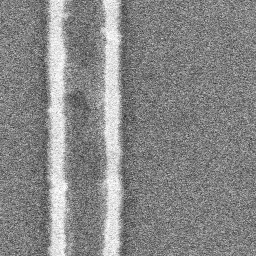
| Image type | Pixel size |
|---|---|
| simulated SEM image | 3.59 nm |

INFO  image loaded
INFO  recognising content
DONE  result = one or a few lines or trenches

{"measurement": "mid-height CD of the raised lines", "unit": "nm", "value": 199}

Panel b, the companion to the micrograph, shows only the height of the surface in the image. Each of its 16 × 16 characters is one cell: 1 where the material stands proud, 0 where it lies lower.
0000111000000000
0000111000000000
0000111000000000
0000111000000000
0000111000000000
0000111000000000
0000111000000000
0000111000000000
0000111000000000
0000111000000000
0000111000000000
0000111000000000
0000111000000000
0000111000000000
0000111000000000
0000111000000000